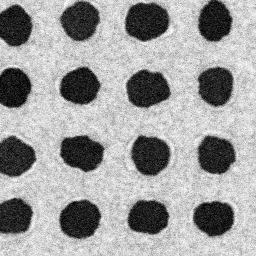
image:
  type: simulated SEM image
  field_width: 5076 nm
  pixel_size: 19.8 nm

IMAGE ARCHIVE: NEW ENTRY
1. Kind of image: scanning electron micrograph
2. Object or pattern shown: a regular array of holes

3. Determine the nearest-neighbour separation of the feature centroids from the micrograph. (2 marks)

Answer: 1320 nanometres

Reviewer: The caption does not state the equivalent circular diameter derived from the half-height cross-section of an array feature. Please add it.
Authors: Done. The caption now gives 40.6 px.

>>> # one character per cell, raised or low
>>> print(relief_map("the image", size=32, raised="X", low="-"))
XXXXXXXXX---XXXXX---XXXXXX--XXXX
---XXXXX----XXXX-----XXXX----XXX
----XXX-----XXXX-----XXXX----XXX
----XXXX----XXXX-----XXXX----XXX
----XXXX----XXXX----XXXXX---XXXX
X--XXXXXXXXXXXXXXXXXXXXXXXXXXXXX
XXXXXXXXXXXXXXXXXXXXXXXXXXXXXXXX
XXXXXXXXXXXXXXXXXXXXXXXXXXXXXXXX
X-XXXXXXXX-XXXXXXXXXXXXXXX--XXXX
---XXXXX----XXXX----XXXXX----XXX
----XXX------XXX-----XXXX----XXX
----XXX-----XXXX-----XXXX----XXX
---XXXXX----XXXX-----XXXX----XXX
XXXXXXXXXXXXXXXXXXXXXXXXXX-XXXXX
XXXXXXXXXXXXXXXXXXXXXXXXXXXXXXXX
XXXXXXXXXXXXXXXXXXXXXXXXXXXXXXXX
XXXXXXXXXXXXXXXXXXXXXXXXXXXXXXXX
---XXXXX----XXXXX---XXXXX----XXX
----XXXX-----XXX-----XXXX-----XX
-----XXX-----XXX-----XXXX-----XX
----XXXX-----XXXX----XXXX----XXX
---XXXXXXX-XXXXXX---XXXXXX--XXXX
XXXXXXXXXXXXXXXXXXXXXXXXXXXXXXXX
XXXXXXXXXXXXXXXXXXXXXXXXXXXXXXXX
XXXXXXXXXXXXXXXXXXXXXXXXXXXXXXXX
----XXXX----XXXXX---XXXXX----XXX
----XXXX----XXXX-----XXX-----XXX
----XXX-----XXXX-----XXX-----XXX
----XXXX----XXXX-----XXXX----XXX
--XXXXXX---XXXXXXXXXXXXXXX-XXXXX
XXXXXXXXXXXXXXXXXXXXXXXXXXXXXXXX
XXXXXXXXXXXXXXXXXXXXXXXXXXXXXXXX